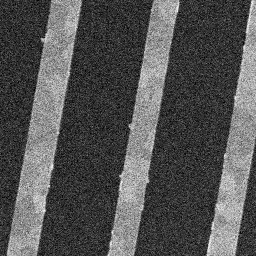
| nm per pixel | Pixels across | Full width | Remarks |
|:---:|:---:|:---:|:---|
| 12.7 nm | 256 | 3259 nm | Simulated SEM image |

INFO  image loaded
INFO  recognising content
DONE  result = one or a few lines or trenches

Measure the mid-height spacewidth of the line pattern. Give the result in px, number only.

71.9